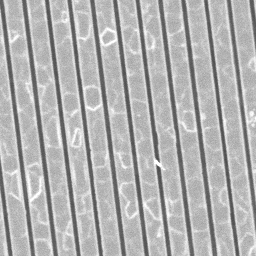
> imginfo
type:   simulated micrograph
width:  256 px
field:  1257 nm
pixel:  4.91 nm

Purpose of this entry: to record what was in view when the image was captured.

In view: parallel lines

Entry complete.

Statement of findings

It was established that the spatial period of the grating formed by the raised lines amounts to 0.111 um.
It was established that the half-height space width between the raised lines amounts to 25 nanometres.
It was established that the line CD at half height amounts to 17.7 px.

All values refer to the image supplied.